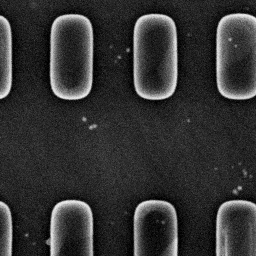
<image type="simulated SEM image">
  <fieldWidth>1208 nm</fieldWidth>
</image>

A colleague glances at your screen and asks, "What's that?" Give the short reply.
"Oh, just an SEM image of wiring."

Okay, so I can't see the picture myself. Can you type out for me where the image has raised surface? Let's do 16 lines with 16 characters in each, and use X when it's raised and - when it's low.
----------------
X--XXX---XX---XX
X--XXX--XXX---XX
X--XXX--XXX---XX
X--XXX--XXX---XX
X--XXX---XX---XX
----------------
----------------
----------------
----------------
----------------
----------------
----------------
X--XXX--XXX---XX
X--XXX--XXX---XX
X--XXX--XXX---XX